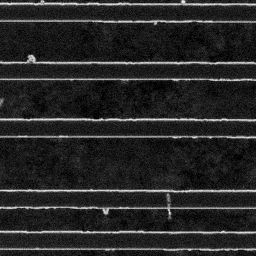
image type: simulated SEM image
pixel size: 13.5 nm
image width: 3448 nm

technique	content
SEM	lines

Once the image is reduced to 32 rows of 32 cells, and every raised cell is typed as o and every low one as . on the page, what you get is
oooo.ooo..............oo........
oooooooooooooooooooooooooooooooo
oooooooooooooooooooooooooooooooo
................................
................................
................................
................................
...o............................
oooooooooooooooooooooooooooooooo
oooooooooooooooooooooooooooooooo
................................
................................
................................
................................
................................
oooooooooooooooooooooooooooooooo
oooooooooooooooooooooooooooooooo
................................
................................
................................
................................
................................
................................
................................
oooooooooooooooooooooooooooooooo
oooooooooooooooooooooooooooooooo
................................
................................
................................
oooooooooooooooooooooooooooooooo
oooooooooooooooooooooooooooooooo
................................